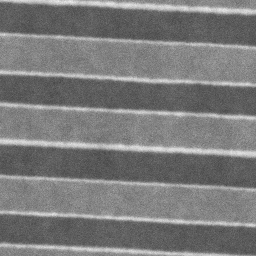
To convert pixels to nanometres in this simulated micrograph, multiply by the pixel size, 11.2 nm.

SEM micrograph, lines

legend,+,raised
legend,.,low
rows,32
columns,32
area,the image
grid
.............+++++++++++++++++++
................................
................................
................................
+++++...........................
++++++++++++++++++++++++........
++++++++++++++++++++++++++++++++
++++++++++++++++++++++++++++++++
++++++++++++++++++++++++++++++++
..........++++++++++++++++++++++
.............................+++
................................
................................
++++++..........................
++++++++++++++++++++++++++++....
++++++++++++++++++++++++++++++++
++++++++++++++++++++++++++++++++
++++++++++++++++++++++++++++++++
................++++++++++++++++
................................
................................
................................
+++++++++.......................
++++++++++++++++++++++++++++....
++++++++++++++++++++++++++++++++
++++++++++++++++++++++++++++++++
++++++++++++++++++++++++++++++++
...................+++++++++++++
................................
................................
................................
++++++++++++++++++..............